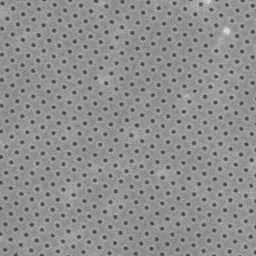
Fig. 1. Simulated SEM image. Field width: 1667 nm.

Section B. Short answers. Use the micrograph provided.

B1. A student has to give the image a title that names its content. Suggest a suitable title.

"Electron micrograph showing a regular array of holes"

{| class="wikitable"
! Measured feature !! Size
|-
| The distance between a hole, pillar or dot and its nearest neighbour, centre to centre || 0.0731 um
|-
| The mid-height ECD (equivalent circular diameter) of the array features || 27.5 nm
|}